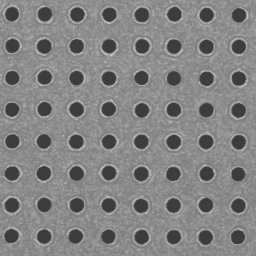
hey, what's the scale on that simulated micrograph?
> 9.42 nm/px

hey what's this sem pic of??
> a regular array of holes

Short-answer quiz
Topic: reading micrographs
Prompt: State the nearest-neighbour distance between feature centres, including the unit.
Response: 296 nm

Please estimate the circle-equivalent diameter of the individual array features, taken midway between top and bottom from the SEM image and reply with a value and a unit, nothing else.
136 nanometers